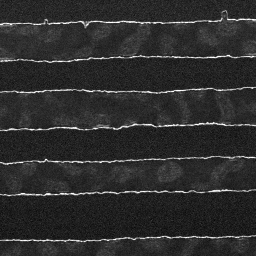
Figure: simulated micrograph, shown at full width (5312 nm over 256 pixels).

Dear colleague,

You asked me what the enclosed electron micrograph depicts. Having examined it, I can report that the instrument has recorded one or a few lines or trenches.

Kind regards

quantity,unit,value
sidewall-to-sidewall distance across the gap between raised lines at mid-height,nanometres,721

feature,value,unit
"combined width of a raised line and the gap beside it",1460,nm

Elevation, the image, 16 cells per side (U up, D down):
UUUUUUUUUUUUUUUU
DDDDDDDDDDDDDDDD
DDDDDDDDDDDDDDDD
DDDDDDDUUDDDDDDD
UUUUUUUUUUUUUUUU
UUUUUUUUUUUUUUUD
DDDDDDDDDDDDDDDD
DDDDDDDDDDDDDDDD
UUUUUUUUUUUUUUUU
UUUUUUUUUUUUUUUU
DDDDDDDDDDDDDDDD
DDDDDDDDDDDDDDDD
UUUUUUUUUUUUUUUU
UUUUUUUUUUUUUUUU
UUUUUUUUUUUUUUUU
DDDDDDDDDDDDDDDD